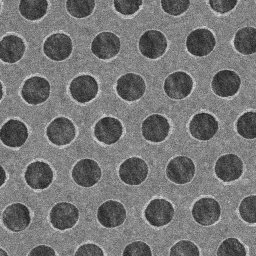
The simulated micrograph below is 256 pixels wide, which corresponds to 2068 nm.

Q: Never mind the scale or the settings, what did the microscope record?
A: a regular array of holes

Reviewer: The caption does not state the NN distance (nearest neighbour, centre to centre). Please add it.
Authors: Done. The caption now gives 382 nanometres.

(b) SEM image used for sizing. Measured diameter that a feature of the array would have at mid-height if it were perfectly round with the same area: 235 nanometres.